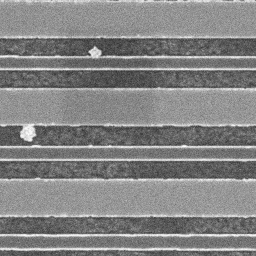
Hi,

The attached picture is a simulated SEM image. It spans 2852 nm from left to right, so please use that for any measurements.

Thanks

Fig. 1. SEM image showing lines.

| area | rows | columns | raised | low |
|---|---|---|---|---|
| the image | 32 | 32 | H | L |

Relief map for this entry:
HHHHHHHHHHHHHHHHHHHHHHHHHHHHHHHH
HHHHHHHHHHHHHHHHHHHHHHHHHHHHHHHH
HHHHHHHHHHHHHHHHHHHHHHHHHHHHHHHH
HHHHHHHHHHHHHHHHHHHHHHHHHHHHHHHH
HHHHHHHHHHHHHHHHHHHHHHHHHHHHHHHH
LLLLLLLLLLLLLLLLLLLLLLLLLLLLLLLL
LLLLLLLLLLLHLLLLLLLLLLLLLLLLLLLL
HHHHHHHHHHHHHHHHHHHHHHHHHHHHHHHH
HHHHHHHHHHHHHHHHHHHHHHHHHHHHHHHH
LLLLLLLLLLLLLLLLLLLLLLLLLLLLLLLL
LLLLLLLLLLLLLLLLLLLLLLLLLLLLLLLL
HHHHHHHHHHHHHHHHHHHHHHHHHHHHHHHH
HHHHHHHHHHHHHHHHHHHHHHHHHHHHHHHH
HHHHHHHHHHHHHHHHHHHHHHHHHHHHHHHH
HHHHHHHHHHHHHHHHHHHHHHHHHHHHHHHH
HHHHHHHHHHHHHHHHHHHHHHHHHHHHHHHH
LLLHLLLLLLLLLLLLLLLLLLLLLLLLLLLL
LLLLLLLLLLLLLLLLLLLLLLLLLLLLLLLL
HHHHHHHHHHHHHHHHHHHHHHHHHHHHHHHH
HHHHHHHHHHHHHHHHHHHHHHHHHHHHHHHH
LLLLLLLLLLLLLLLLLLLLLLLLLLLLLLLL
LLLLLLLLLLLLLLLLLLLLLLLLLLLLLLLL
LHHHHHHHHHHHHLHHLHLLLHLLLLHLLLLH
HHHHHHHHHHHHHHHHHHHHHHHHHHHHHHHH
HHHHHHHHHHHHHHHHHHHHHHHHHHHHHHHH
HHHHHHHHHHHHHHHHHHHHHHHHHHHHHHHH
HHHHHHHHHHHHHHHHHHHHHHHHHHHHHHHH
LLLLLLLLLLLLLLLLLLLLLLLLLLLLLLLL
LLLLLLLLLLLLLLLLLLLLLLLLLLLLLLLL
HHHHHHHHHHHHHHHHHHHHHHHHHHHHHHHH
HHHHHHHHHHHHHHHHHHHHHHHHHHHHHHHH
LLLLLLLLLLLLLLLLLLLLLLLLLLLLLLLL